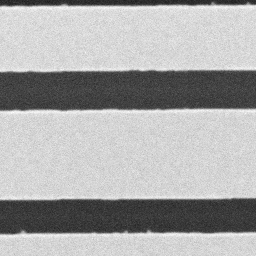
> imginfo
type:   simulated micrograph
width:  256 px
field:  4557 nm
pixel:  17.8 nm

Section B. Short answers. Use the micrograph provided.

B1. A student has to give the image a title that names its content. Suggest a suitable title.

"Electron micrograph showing lines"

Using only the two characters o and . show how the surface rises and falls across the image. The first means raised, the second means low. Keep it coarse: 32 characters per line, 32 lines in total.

................................
oooooooooooooooooooooooooooooooo
oooooooooooooooooooooooooooooooo
oooooooooooooooooooooooooooooooo
oooooooooooooooooooooooooooooooo
oooooooooooooooooooooooooooooooo
oooooooooooooooooooooooooooooooo
oooooooooooooooooooooooooooooooo
oooooooooooooooooooooooooooooooo
................................
................................
................................
................................
................................
oooooooooooooooooooooooooooooooo
oooooooooooooooooooooooooooooooo
oooooooooooooooooooooooooooooooo
oooooooooooooooooooooooooooooooo
oooooooooooooooooooooooooooooooo
oooooooooooooooooooooooooooooooo
oooooooooooooooooooooooooooooooo
oooooooooooooooooooooooooooooooo
oooooooooooooooooooooooooooooooo
oooooooooooooooooooooooooooooooo
oooooooooooooooooooooooooooooooo
................................
................................
................................
................................
oooooooooooooooooooooooooooooooo
oooooooooooooooooooooooooooooooo
oooooooooooooooooooooooooooooooo